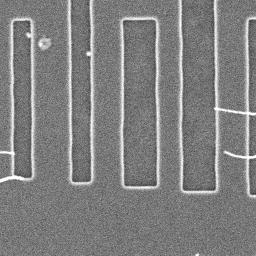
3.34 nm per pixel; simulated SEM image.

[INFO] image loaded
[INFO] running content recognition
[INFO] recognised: groups of lines, slits or small figures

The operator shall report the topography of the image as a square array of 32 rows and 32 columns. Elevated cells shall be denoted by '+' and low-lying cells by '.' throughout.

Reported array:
+++++++++..++++++++++++....+++++
+++++++++..++++++++++++....+++++
++.++++++..+++++...++++....++++.
++..+++++..++++.....+++....++++.
++..+++++..++++.....+++....++++.
++..+++++..++++.....+++....++++.
++..+++++..++++.....+++....++++.
++..+++++..++++.....+++....++++.
++..+++++..++++.....+++....++++.
++..+++++..++++.....+++....++++.
++..+++++..++++.....+++....++++.
++..+++++..++++.....+++....++++.
++..+++++..++++.....+++....++++.
++..+++++..++++.....+++....++++.
++..+++++..++++.....+++....++++.
++..+++++..++++.....+++....++++.
++..+++++..++++.....+++....++++.
++..+++++..++++.....+++....++++.
++..+++++..++++.....+++....++++.
++..+++++..++++.....+++....++++.
++..+++++..++++.....+++....++++.
++..+++++..++++.....+++....++++.
+++++++++..++++.....+++....++++.
+++++++++++++++++++++++....++++.
++++++++++++++++++++++++++++++++
++++++++++++++++++++++++++++++++
++++++++++++++++++++++++++++++++
++++++++++++++++++++++++++++++++
++++++++++++++++++++++++++++++++
++++++++++++++++++++++++++++++++
++++++++++++++++++++++++++++++++
++++++++++++++++++++++++++++++++